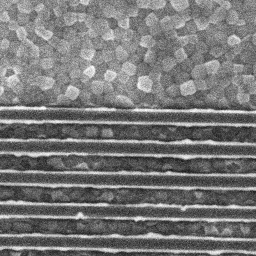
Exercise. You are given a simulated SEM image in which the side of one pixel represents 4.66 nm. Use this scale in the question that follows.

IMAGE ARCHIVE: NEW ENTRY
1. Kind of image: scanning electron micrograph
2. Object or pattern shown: parallel lines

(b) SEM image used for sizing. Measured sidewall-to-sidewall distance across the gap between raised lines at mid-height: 72.8 nm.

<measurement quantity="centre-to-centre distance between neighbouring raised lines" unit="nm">148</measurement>